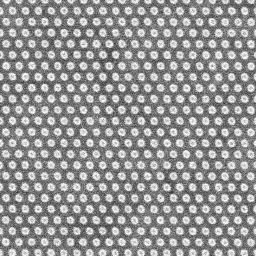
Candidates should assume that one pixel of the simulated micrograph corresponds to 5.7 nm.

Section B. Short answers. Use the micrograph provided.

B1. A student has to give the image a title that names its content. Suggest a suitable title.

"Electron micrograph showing a regular array of raised bodies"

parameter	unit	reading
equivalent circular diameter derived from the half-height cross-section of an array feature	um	0.038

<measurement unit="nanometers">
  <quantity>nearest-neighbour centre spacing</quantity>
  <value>71.6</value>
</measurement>